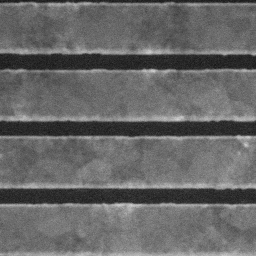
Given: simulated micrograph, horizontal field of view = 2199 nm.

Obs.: lines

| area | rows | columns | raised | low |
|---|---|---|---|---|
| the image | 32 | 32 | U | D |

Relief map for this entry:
UUUUUUUUUUUUUUUUUUUUUUUUUUUUUUUU
UUUUUUUUUUUUUUUUUUUUUUUUUUUUUUUU
UUUUUUUUUUUUUUUUUUUUUUUUUUUUUUUU
UUUUUUUUUUUUUUUUUUUUUUUUUUUUUUUU
UUUUUUUUUUUUUUUUUUUUUUUUUUUUUUUU
UUUUUUUUUUUUUUUUUUUUUUUUUUUUUUUU
DDUUDDDUUUUUUUUUUUUUUUUUUUUUUUUU
DDDDDDDDDDDDDDDDDDDDDDDDDDDDDDDD
DDDDDDDDDDDDDDDDDDDDDDDDDDDDDDDD
UUUUUUUUUUUUUUUUUUUUUUUUUUUUUUUU
UUUUUUUUUUUUUUUUUUUUUUUUUUUUUUUU
UUUUUUUUUUUUUUUUUUUUUUUUUUUUUUUU
UUUUUUUUUUUUUUUUUUUUUUUUUUUUUUUU
UUUUUUUUUUUUUUUUUUUUUUUUUUUUUUUU
UUUUUUUUUUUUUUUUUUUUUUUUUUUUUUUU
DDDDDDDDDDDDDDDDDDDDDDDDDDDDDDDD
DDDDDDDDDDDDDDDDDDDDDDDDDDDDDDDD
UUUUUUUUUUUUUUUUUUUUUUUUUUUUUUUU
UUUUUUUUUUUUUUUUUUUUUUUUUUUUUUUU
UUUUUUUUUUUUUUUUUUUUUUUUUUUUUUUU
UUUUUUUUUUUUUUUUUUUUUUUUUUUUUUUU
UUUUUUUUUUUUUUUUUUUUUUUUUUUUUUUU
UUUUUUUUUUUUUUUUUUUUUUUUUUUUUUUU
DDDDDDDDDDDDDDDDDDDDDDDDDDDDDDDD
DDDDDDDDDDDDDDDDDDDDDDDDDDDDDDDD
DDDDDDDDUDDDDDDUUDDDDUDDDDDDDDDD
UUUUUUUUUUUUUUUUUUUUUUUUUUUUUUUU
UUUUUUUUUUUUUUUUUUUUUUUUUUUUUUUU
UUUUUUUUUUUUUUUUUUUUUUUUUUUUUUUU
UUUUUUUUUUUUUUUUUUUUUUUUUUUUUUUU
UUUUUUUUUUUUUUUUUUUUUUUUUUUUUUUU
UUUUUUUUUUUUUUUUUUUUUUUUUUUUUUUU